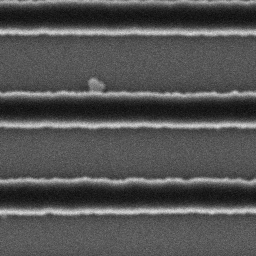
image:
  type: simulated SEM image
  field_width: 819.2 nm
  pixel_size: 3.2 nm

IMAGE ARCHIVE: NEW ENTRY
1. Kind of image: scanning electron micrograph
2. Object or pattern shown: lines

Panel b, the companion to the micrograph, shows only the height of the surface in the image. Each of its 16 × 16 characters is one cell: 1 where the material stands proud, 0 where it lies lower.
1111111111111111
1111111111111111
0000000000000000
0000000000000000
0000000000000000
0000000000000000
1111111111111111
1111111111111111
0000000000000000
0000000000000000
0000000000000000
1111111111111111
1111111111111111
0000000000000000
0000000000000000
0000000000000000